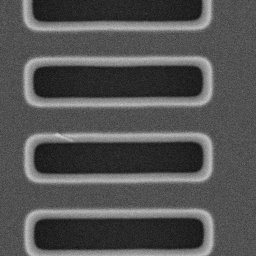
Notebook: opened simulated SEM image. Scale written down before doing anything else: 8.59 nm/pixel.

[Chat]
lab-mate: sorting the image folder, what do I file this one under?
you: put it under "groups of lines, slits or small figures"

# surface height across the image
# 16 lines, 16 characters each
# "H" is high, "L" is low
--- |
HHLLLLLLLLLLLHHH
HHLLLLLLLLLLHHHH
HHHHHHHHHHHHHHHH
HHHHHHHHHHHHHHHH
HHLLLLLLLLLLLHHH
HHLLLLLLLLLLLHHH
HHHHHHHHHHHHHHHH
HHHHHHHHHHHHHHHH
HHHHHHHHHHHHHHHH
HHLLLLLLLLLLLHHH
HHLLLLLLLLLLLHHH
HHHHHHHHHHHHHHHH
HHHHHHHHHHHHHHHH
HHLLLLLLLLLLHHHH
HHLLLLLLLLLLLHHH
HHLLLLLLLLLLLHHH